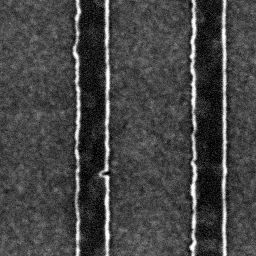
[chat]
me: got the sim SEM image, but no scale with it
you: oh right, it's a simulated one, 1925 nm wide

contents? one or a few lines or trenches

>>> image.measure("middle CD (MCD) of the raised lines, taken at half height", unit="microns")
0.234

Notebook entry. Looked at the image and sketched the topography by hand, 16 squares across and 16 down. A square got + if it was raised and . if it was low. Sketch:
.....++.....++..
.....++.....++..
.....++.....++..
.....++.....++..
.....++.....++..
.....++.....++..
.....++.....++..
.....++.....++..
.....++.....++..
.....++.....++..
.....++.....++..
.....++.....++..
.....++.....++..
.....++.....++..
.....++.....++..
.....++.....++..